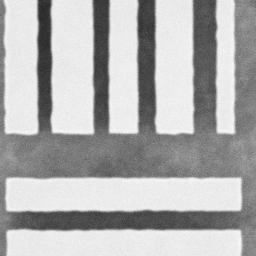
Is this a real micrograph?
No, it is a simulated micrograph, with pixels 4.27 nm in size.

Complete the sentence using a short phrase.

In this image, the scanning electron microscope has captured groups of lines, slits or small figures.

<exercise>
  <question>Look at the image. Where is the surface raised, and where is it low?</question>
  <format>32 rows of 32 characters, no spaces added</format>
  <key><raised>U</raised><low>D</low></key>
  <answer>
DUUUUDDUUUUUDDUUUDDDUUUUDDDUUDDD
DUUUUDUUUUUUDDUUUDDUUUUUDDDUUDDD
DUUUUDDUUUUUDDUUUDDDUUUUDDDUUDDD
DUUUUDDUUUUUDDUUUDDDUUUUDDDUUDDD
DUUUUDDUUUUUDDUUUDDUUUUUDDDUUDDD
DUUUUDDUUUUUDDUUUDDDUUUUDDDUUDDD
DUUUUDDUUUUUDDUUUDDDUUUUDDDUUDDD
DUUUUDDUUUUUDDUUUDDDUUUUDDDUUDDD
DUUUUDDUUUUUDDUUUDDUUUUUDDDUUDDD
DUUUUDDUUUUUDDUUUDDUUUUUDDDUUDDD
DUUUUDDUUUUUDDUUUDDUUUUUDDDUUDDD
DUUUUDDUUUUUDDUUUDDDUUUUDDDUUDDD
DUUUUDDUUUUUDDUUUDDDUUUUDDDUUDDD
DUUUUDDUUUUUDDUUUDDDUUUUDDDUUDDD
DUUUUDDUUUUUDDUUUDDUUUUUDDDUUDDD
DUUUUDDUUUUUDDUUUDDUUUUUDDDUUDDD
DUUUDDDUUUUDDDUUUDDDUUUUDDDDUDDD
DDDDDDDDDDDDDDDDDDDDDDDDDDDDDDDD
DDDDDDDDDDDDDDDDDDDDDDDDDDDDDDDD
DDDDDDDDDDDDDDDDDDDDDDDDDDDDDDDD
DDDDDDDDDDDDDDDDDDDDDDDDDDDDDDDD
DDDDDDDDDDDDDDDDDDDDDDDDDDDDDDDD
DUUUUUUUUUUUUUUUUUUUUUUUUUUUUUDD
DUUUUUUUUUUUUUUUUUUUUUUUUUUUUUDD
DUUUUUUUUUUUUUUUUUUUUUUUUUUUUUDD
DUUUUUUUUUUUUUUUUUUUUUUUUUUUUUDD
DDDDDDDDDDDDDDDDDDDDDDDDDDDDDDDD
DDDDDDDDDDDDDDDDDDDDDDDDDDDDDDDD
DDDDDDDDDDDDDDDDDDDDDDDDDDDDDDDD
DUUUUUUUUUUUUUUUUUUUUUUUUUUUUUDD
DUUUUUUUUUUUUUUUUUUUUUUUUUUUUUDD
DUUUUUUUUUUUUUUUUUUUUUUUUUUUUUDD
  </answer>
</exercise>